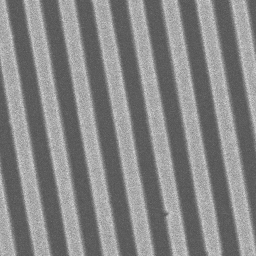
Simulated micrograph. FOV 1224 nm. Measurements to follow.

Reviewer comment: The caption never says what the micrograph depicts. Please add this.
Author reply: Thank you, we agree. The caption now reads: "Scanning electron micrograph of parallel lines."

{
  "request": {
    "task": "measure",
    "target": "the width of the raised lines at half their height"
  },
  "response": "83.5 nanometers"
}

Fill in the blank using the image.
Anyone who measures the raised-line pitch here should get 162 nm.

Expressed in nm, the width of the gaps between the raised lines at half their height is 79.4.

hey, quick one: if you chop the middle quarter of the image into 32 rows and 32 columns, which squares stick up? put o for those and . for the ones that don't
.oooo.....oooo.....oooo....oooo.
.ooooo....oooo.....oooo....ooooo
..oooo....ooooo....oooo.....oooo
..oooo.....oooo....oooo.....oooo
..oooo.....oooo....oooo.....oooo
..oooo.....oooo.....oooo....oooo
..oooo.....oooo.....oooo....oooo
...oooo....ooooo....oooo.....ooo
...oooo....ooooo....oooo.....ooo
...oooo.....oooo....oooo.....ooo
...oooo.....oooo....oooo.....ooo
...oooo.....oooo.....oooo....ooo
...ooooo....oooo.....oooo....ooo
....oooo....ooooo....oooo.....oo
....oooo....ooooo....oooo.....oo
....oooo.....oooo....oooo.....oo
....oooo.....oooo....ooooo....oo
....oooo.....oooo.....oooo....oo
.....oooo....oooo.....oooo....oo
.....oooo....ooooo....oooo.....o
o....oooo.....oooo....oooo.....o
o....oooo.....oooo....ooooo....o
o....oooo.....oooo.....oooo....o
o....oooo.....oooo.....oooo....o
o.....oooo....ooooo....oooo....o
o.....oooo....oooo.....oooo....o
oo....oooo.....oooo....oooo.....
oo....oooo.....oooo....oooo.....
oo....oooo.....oooo.....oooo....
oo....ooooo....oooo.....oooo....
oo.....oooo....ooooo....oooo....
oo.....oooo....ooooo....oooo....